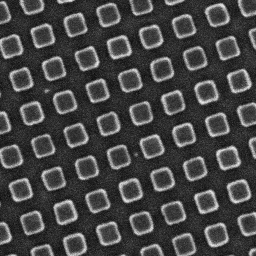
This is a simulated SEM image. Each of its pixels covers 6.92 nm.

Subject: a regular array of raised bodies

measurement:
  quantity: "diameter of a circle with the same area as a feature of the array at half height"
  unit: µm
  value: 0.15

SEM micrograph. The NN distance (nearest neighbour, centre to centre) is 34.3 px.